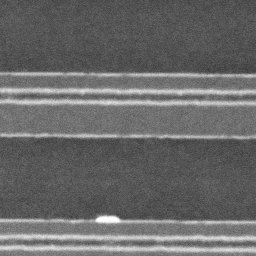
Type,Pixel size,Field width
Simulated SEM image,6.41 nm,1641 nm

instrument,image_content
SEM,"lines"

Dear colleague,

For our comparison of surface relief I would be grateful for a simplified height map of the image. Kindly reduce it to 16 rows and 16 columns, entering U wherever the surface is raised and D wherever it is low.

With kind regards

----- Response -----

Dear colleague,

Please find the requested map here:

DDDDDDDDDDDDDDDD
DDDDDDDDDDDDDDDD
DDDDDDDDDDDDDDDD
DDDDDDDDDDDDDDDD
DDDDDDDDDDDDDDDD
UUUUUUUUUUUUUUUU
UUUUUUUUUUUUUUUU
UUUUUUUUUUUUUUUU
DDDDUUUUUUUUUUUU
DDDDDDDDDDDDDDDD
DDDDDDDDDDDDDDDD
DDDDDDDDDDDDDDDD
DDDDDDDDDDDDDDDD
DDDDDDDDDDDDDDDD
UUUUUUUUUUUUUUUU
UUUUUUUUUUUUUUUU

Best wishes